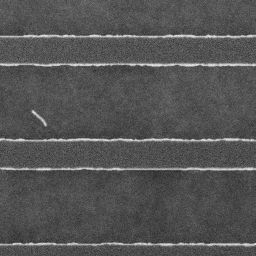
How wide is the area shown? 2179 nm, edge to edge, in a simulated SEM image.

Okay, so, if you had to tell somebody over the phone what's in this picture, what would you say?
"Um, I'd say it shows lines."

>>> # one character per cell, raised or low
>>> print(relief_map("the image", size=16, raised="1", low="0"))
0000000000000000
0000000000000000
1111111111111111
1111111111111111
0000000000000000
0000000000000000
0000000000000000
0000000000000000
0000000000000000
1111111111111111
1111111111111111
0000000000000000
0000000000000000
0000000000000000
0000000000000000
1111111111111111